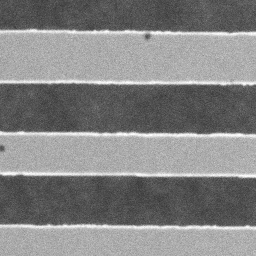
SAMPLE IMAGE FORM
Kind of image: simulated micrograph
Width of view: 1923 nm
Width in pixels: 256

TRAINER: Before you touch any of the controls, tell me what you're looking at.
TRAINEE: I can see lines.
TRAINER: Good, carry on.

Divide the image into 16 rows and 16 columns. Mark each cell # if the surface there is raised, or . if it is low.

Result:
................
................
################
################
################
................
................
................
################
################
################
................
................
................
################
################